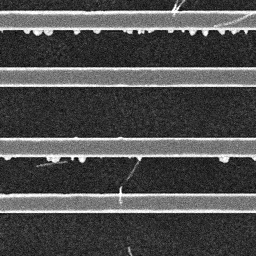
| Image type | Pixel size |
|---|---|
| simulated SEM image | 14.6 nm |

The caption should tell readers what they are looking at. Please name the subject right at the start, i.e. lines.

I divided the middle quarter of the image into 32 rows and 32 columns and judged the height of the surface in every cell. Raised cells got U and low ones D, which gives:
DDDDDDDDDDDDDDDDDDDDDDDDDDDDDDDD
UUUUUUUUUUUUUUUUUUUUUUUUUUUUUUUU
UUUUUUUUUUUUUUUUUUUUUUUUUUUUUUUU
UUUUUUUUUUUUUUUUUUUUUUUUUUUUUUUU
UUUUUUUUUUUUUUUUUUUUUUUUUUUUUUUU
UUUUUUUUUUUUUUUUUUUUUUUUUUUUUUUU
DDDDDDDDDDDDDDDDDDDDDDDDDDDDDDDD
DDDDDDDDDDDDDDDDDDDDDDDDDDDDDDDD
DDDDDDDDDDDDDDDDDDDDDDDDDDDDDDDD
DDDDDDDDDDDDDDDDDDDDDDDDDDDDDDDD
DDDDDDDDDDDDDDDDDDDDDDDDDDDDDDDD
DDDDDDDDDDDDDDDDDDDDDDDDDDDDDDDD
DDDDDDDDDDDDDDDDDDDDDDDDDDDDDDDD
DDDDDDDDDDDDDDDDDDDDDDDDDDDDDDDD
DDDDDDDDDDDDDDDDDDDDDDDDDDDDDDDD
DDDDDDDDDDDDDDDDDDDDDDDDDDDDDDDD
DDDDDDDDDDDDDDDDDDDDDDDDDDDDDDDD
DDDDDDDDDDDDDDDDDDDDDDDDDDDDDDDD
DDDDDDDDDDDDDDDDDDDDDDDDDDDDDDDD
UUUUUUUUUUUUUUUUUUUUUUUUUUUUUUUU
UUUUUUUUUUUUUUUUUUUUUUUUUUUUUUUU
UUUUUUUUUUUUUUUUUUUUUUUUUUUUUUUU
UUUUUUUUUUUUUUUUUUUUUUUUUUUUUUUU
DDDDDDDDDDDDDDDDDDDDDDDDDDDDDDDD
DDDDDDDDDDDDDDDDDDDDDDDDDDDDDDDD
DDDDDDDDDDDDDDDDDDDDDDDDDDDDDDDD
DDDDDDDDDDDDDDDDDDDDDDDDDDDDDDDD
DDDDDDDDDDDDDDDDDDDDDDDDDDDDDDDD
DDDDDDDDDDDDDDDDDDDDDDDDDDDDDDDD
DDDDDDDDDDDDDDDDDDDDDDDDDDDDDDDD
DDDDDDDDDDDDDDDDDDDDDDDDDDDDDDDD
DDDDDDDDDDDDDDDDDDDDDDDDDDDDDDDD